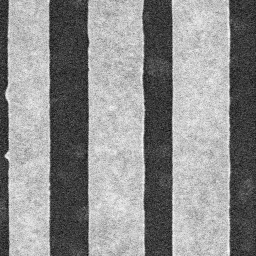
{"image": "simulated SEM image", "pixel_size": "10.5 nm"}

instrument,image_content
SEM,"one or a few lines or trenches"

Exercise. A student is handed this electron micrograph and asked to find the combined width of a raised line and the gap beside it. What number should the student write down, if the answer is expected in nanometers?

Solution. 906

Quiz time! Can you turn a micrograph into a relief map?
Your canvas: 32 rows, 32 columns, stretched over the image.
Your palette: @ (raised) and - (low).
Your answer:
-@@@@@-----@@@@@@@----@@@@@@----
-@@@@@-----@@@@@@@----@@@@@@----
-@@@@@-----@@@@@@@----@@@@@@----
-@@@@@-----@@@@@@@----@@@@@@@---
-@@@@@-----@@@@@@@----@@@@@@@---
-@@@@@-----@@@@@@@----@@@@@@@---
-@@@@@-----@@@@@@@----@@@@@@@---
-@@@@@-----@@@@@@@----@@@@@@@---
-@@@@@-----@@@@@@@----@@@@@@@---
-@@@@@-----@@@@@@@----@@@@@@@---
-@@@@@-----@@@@@@@----@@@@@@@---
-@@@@@-----@@@@@@@----@@@@@@@---
-@@@@@-----@@@@@@@----@@@@@@@---
-@@@@@-----@@@@@@@----@@@@@@@---
-@@@@@-----@@@@@@@----@@@@@@----
-@@@@@-----@@@@@@@----@@@@@@@---
-@@@@@-----@@@@@@@----@@@@@@@---
-@@@@@-----@@@@@@@----@@@@@@@---
-@@@@@-----@@@@@@@----@@@@@@@---
-@@@@@-----@@@@@@@----@@@@@@@---
-@@@@@-----@@@@@@@----@@@@@@@---
-@@@@@-----@@@@@@@----@@@@@@@---
-@@@@@-----@@@@@@@----@@@@@@@---
-@@@@@-----@@@@@@@----@@@@@@@---
-@@@@@-----@@@@@@@----@@@@@@@---
-@@@@@-----@@@@@@@----@@@@@@@---
-@@@@@-----@@@@@@@----@@@@@@@---
-@@@@@-----@@@@@@@----@@@@@@@---
-@@@@@-----@@@@@@@----@@@@@@@---
-@@@@@-----@@@@@@@----@@@@@@@---
-@@@@@-----@@@@@@@----@@@@@@@---
-@@@@@-----@@@@@@@----@@@@@@@---